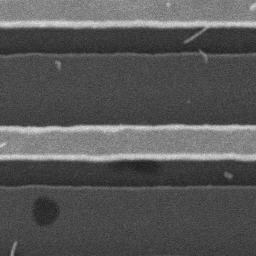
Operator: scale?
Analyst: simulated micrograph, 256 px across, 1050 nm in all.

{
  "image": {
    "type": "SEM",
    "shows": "lines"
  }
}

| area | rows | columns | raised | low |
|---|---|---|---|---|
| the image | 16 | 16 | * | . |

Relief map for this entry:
****************
****************
................
................
................
................
................
................
****************
****************
................
................
................
................
................
................